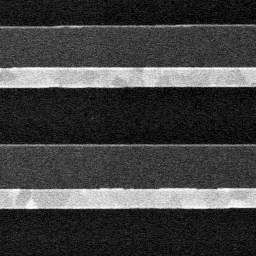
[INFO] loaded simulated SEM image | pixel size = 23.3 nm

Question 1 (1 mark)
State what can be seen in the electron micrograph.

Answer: lines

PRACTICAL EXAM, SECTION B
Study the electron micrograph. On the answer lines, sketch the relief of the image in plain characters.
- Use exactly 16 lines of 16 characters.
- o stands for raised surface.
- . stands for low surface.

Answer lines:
................
................
oooooooooooooooo
oooooooooooooooo
oooooooooooooooo
................
................
................
................
oooooooooooooooo
oooooooooooooooo
oooooooooooooooo
oooooooooooooooo
................
................
................